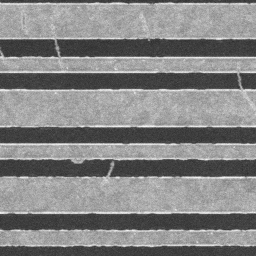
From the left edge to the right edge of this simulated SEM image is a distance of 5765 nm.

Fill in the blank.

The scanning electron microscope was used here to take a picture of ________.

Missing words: lines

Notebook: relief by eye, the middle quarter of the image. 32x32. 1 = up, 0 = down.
11111111111111111111111111111111
11111111111111111111111111111111
00000000000000000000000000000000
00000000000000000000000000000000
00000000000000000000000000000000
00000000000000000000000000000000
00000000000000000000000000000000
11111111111111111111111111111111
11111111111111111111111111111111
11111111111111111111111111111111
11111111111111111111111111111111
11111111111111111111111111111111
11111111111111111111111111111111
11111111111111111111111111111111
11111111111111111111111111111111
11111111111111111111111111111111
00000000000000000000000000000000
00000000000000000000000000000000
00000000000000000000000000000000
00000000000000000000000000000000
11111111111111111111111111111111
11111111111111111111111111111111
11111111111111111111111111111111
11111111111111111111111111111111
00010000000000000000000000000000
00000000000000000000000000000000
00000000000000000000000000000000
00000000000000000000000000000000
11111111111111111111111111111111
11111111111111111111111111111111
11111111111111111111111111111111
11111111111111111111111111111111